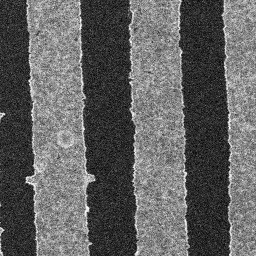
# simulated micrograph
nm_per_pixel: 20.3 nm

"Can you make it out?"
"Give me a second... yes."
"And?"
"one or a few lines or trenches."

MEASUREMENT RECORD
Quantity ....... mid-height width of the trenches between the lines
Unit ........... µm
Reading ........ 0.928